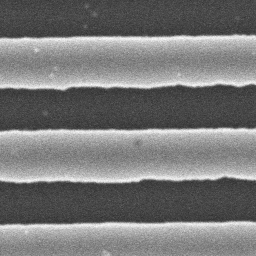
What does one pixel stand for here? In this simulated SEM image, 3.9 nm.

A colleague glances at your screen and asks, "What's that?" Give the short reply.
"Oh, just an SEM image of lines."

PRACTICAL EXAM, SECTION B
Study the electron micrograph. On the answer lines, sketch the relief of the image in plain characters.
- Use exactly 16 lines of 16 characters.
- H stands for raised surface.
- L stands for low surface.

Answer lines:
LLLLLLLLLLLLLLLL
LLLLLLLLLLLLLLLL
HHHHHHHHHHHHHHHH
HHHHHHHHHHHHHHHH
HHHHHHHHHHHHHHHH
HHHHLLLLLHLLLLLL
LLLLLLLLLLLLLLLL
LLLLLLLLLLLLLLLL
HHHHHHHHHHHHHHHH
HHHHHHHHHHHHHHHH
HHHHHHHHHHHHHHHH
LLLLLLLLLLLLLLLL
LLLLLLLLLLLLLLLL
LLLLLLLLLLLLLLLL
HHHHHHHHHHHHHHHH
HHHHHHHHHHHHHHHH